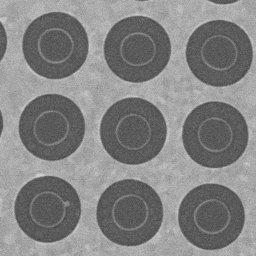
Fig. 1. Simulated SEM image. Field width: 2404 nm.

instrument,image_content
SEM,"an array of small figures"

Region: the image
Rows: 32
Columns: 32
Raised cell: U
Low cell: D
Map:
UUUUUUUUUUUUUUUUUUUUUUUUUUUDDUUU
UUUUUUUDUUUUUUUUUUUUUUUUUUUUUUUU
UUUUDDDDDDUUUUUDDDDUUUUUUUUDUUUU
DUUDDDDDDDDUUUDDDDDDUUUUUDDDDDUU
DUUDDUUUUDDUUDDDUUDDDUUUDDDUDDDU
DUUDDUUUUDDUUDDUUUUDDUUDDUUUUDDU
DUUDDUUUUDDUUDDUUUUDDUUDDUUUUUDD
UUUDDDUUDDDUUDDDUUUDDUUDDUUUUDDD
UUUUDDDDDDUUUUDDDDDDDUUUDDDUUDDU
UUUUUDDDDUUUUUUDDDDDUUUUDDDDDDDU
UUUUUUUUUUUUUUUUUUUUUUUUUUDDDUUU
UUUUUUUUUUUUUUUUUUUUUUUUUUUUUUUU
UUUUDDDDDUUUUUUDDDUUUUUUUUUUUUUU
UUUDDDDDDDUUUUDDDDDDUUUUDDDDDUUU
UUUDDUUUDDUUUDDDUDDDUUUDDDDDDDUU
UUDDUUUUDDDUDDDUUUUDDUUDDUUUDDDU
UUDDUUUUDDDUDDDUUUUDDUUDDUUUUDDU
UUUDDUUUDDUUUDDUUUUDDUUDDUUUUDDU
UUUDDDDDDDUUUDDDUDDDUUUDDDUUDDDU
UUUUDDDDDUUUUUDDDDDDUUUUDDDDDDUU
UUUUUUUUUUUUUUUUDDUUUUUUUDDDDUUU
UUUUUUUUUUUUUUUUUUUUUUUUUUUUUUUU
UUUUDDDDUUUUUUUDDUUUUUUUUUUUUUUU
UUUDDDDDDUUUUDDDDDDUUUUUDDDDDUUU
UUDDDUUDDDUUUDDDUDDDUUUDDDDDDDUU
UUDDUUUUDDUUDDUUUUDDUUDDDUUUDDUU
UUDDUUUUDDUUDDUUUUDDUUDDUUUUUDDU
UUDDUUUUDDUUDDUUUUDDUUDDUUUUUDDU
UUUDDDDDDDUUDDDUUDDDUUDDDUUUDDUU
UUUDDDDDDUUUUDDDDDDUUUUDDDDDDDUU
UUUUUUUUUUUUUUUDDDUUUUUUDDDDDUUU
UUUUUUUUUUUUUUUUUUUUUUUUUUUUUUUU